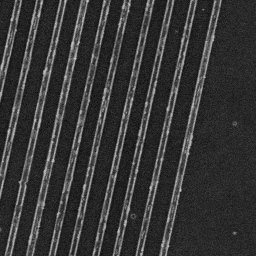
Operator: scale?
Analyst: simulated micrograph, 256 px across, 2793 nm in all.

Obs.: parallel lines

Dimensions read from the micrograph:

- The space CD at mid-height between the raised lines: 172 nm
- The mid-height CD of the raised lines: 6.48 px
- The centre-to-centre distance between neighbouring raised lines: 237 nanometers